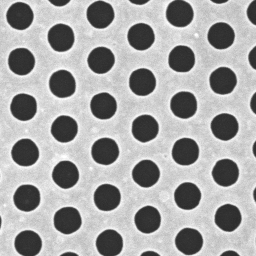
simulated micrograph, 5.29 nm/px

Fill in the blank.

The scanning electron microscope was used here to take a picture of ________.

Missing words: a regular array of holes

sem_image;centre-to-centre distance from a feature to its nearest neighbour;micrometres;0.239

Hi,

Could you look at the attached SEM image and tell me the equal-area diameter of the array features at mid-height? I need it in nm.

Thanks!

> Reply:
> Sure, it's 146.